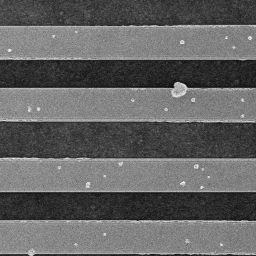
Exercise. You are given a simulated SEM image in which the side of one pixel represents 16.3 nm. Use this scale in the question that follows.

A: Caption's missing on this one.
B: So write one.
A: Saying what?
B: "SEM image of lines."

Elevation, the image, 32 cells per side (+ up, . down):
................................
................................
................................
++++++++++++++++++++++++++++++++
++++++++++++++++++++++++++++++++
++++++++++++++++++++++++++++++++
++++++++++++++++++++++++++++++++
..............................+.
................................
................................
......................+.........
++++++++++++++++++++++++++++++++
++++++++++++++++++++++++++++++++
++++++++++++++++++++++++++++++++
++++++++++++++++++++++++++++++++
................................
................................
................................
................................
................................
++++++++++++++++++++++++++++++++
++++++++++++++++++++++++++++++++
++++++++++++++++++++++++++++++++
++++++++++++++++++++++++++++++++
................................
................................
................................
................................
++++++++++++++++++++++++++++++++
++++++++++++++++++++++++++++++++
++++++++++++++++++++++++++++++++
++++++++++++++++++++++++++++++++